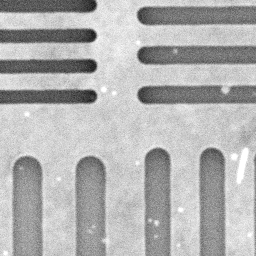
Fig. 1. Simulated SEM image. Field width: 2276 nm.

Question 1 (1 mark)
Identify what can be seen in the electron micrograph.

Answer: groups of lines, slits or small figures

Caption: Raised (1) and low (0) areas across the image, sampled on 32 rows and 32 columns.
00000000000011111111111111111111
00000000000011111000000000000000
11111111111111111000000000000000
11111111100111111111111111111111
00000000000011111111111111111111
00001111111111111111111111111111
11111111111111111000000000000000
00000000000011111000000000000000
00000000000011111111111111111111
11111111111111111111111111111111
11111111111111111111111111111111
00000000000011111000000000000000
00000000000011111000000000000000
11111111111111111111111111111111
11111111111111111111111111111111
11111111111111111111111111111111
11111111111111111111111111111111
11111111111111111111111111111111
11111111111111111110111111011111
11101111111011111100011110001111
11000111110001111100001110001111
10000111100001111100011110001111
10000111100001111100011110001111
10000111100001111100011110001111
10000111100001111100001110001111
10000111100001111100001110001111
10000111100001111100001110001111
10000111100001111100001110001111
10000111100001111100001110001111
10000111100001111100001110001111
10000111100001111100001110001111
11000111100001111100001110001111